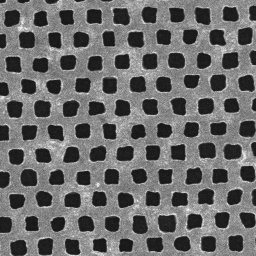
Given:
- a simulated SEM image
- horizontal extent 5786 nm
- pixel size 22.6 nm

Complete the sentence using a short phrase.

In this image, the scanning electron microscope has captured a regular array of holes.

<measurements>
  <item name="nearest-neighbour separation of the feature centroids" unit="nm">576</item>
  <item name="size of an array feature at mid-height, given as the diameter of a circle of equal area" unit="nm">370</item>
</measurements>